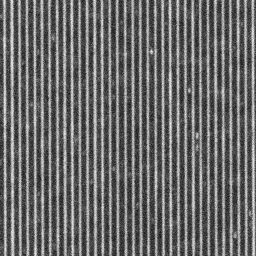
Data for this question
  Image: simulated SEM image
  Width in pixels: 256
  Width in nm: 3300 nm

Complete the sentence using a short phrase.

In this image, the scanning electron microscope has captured parallel lines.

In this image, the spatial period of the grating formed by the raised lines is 97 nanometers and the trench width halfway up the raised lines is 79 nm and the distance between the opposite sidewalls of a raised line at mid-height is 20.9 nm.